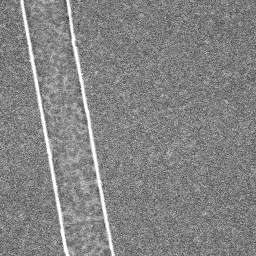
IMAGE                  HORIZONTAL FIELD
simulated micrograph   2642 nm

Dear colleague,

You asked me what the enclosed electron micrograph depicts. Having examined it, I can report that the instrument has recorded one or a few lines or trenches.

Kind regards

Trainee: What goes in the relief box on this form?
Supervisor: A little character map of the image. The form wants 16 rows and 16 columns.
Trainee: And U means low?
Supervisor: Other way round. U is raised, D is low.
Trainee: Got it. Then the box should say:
UDDDUUUUUUUUUUUU
UUDDUUUUUUUUUUUU
UUDDDUUUUUUUUUUU
UUDDDUUUUUUUUUUU
UUDDDUUUUUUUUUUU
UUDDDUUUUUUUUUUU
UUUDDUUUUUUUUUUU
UUUDDDUUUUUUUUUU
UUUDDDUUUUUUUUUU
UUUDDDUUUUUUUUUU
UUUDDDUUUUUUUUUU
UUUDDDUUUUUUUUUU
UUUUDDUUUUUUUUUU
UUUUDDDUUUUUUUUU
UUUUDDDUUUUUUUUU
UUUUDDDUUUUUUUUU